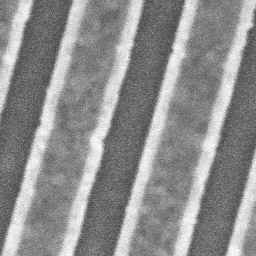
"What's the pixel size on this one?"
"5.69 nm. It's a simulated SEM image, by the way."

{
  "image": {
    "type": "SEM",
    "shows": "one or a few lines or trenches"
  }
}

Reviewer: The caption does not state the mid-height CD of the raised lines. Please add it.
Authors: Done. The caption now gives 334 nm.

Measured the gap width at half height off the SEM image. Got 278 nanometres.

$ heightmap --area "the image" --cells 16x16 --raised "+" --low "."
++...++++...++++
+...++++....+++.
+...++++...++++.
+...++++...++++.
....++++...++++.
...++++...++++..
...++++...++++..
...++++...++++..
...+++....+++...
..++++...++++...
..++++...++++...
..+++....++++...
.++++...++++...+
.++++...++++...+
.++++...++++...+
.+++....+++....+